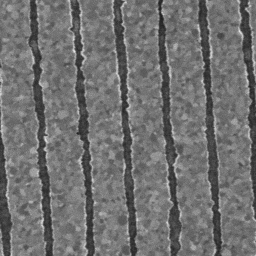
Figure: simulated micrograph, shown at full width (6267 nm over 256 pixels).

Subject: parallel lines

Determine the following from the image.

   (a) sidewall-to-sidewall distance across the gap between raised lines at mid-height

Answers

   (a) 220 nanometers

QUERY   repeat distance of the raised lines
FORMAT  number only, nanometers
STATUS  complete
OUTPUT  1040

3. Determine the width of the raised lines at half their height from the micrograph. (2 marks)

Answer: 821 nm